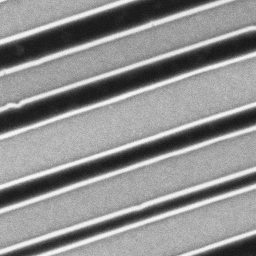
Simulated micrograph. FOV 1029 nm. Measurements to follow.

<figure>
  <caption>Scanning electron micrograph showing one or a few lines or trenches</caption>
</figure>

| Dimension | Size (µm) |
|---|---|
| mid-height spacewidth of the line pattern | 0.155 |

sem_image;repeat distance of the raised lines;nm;263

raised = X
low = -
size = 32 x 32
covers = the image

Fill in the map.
--------------XXXXXXXXXXXXX-----
-----------XXXXXXXXXXXXX--------
--------XXXXXXXXXXXXX-----------
-----XXXXXXXXXXXXX-------------X
--XXXXXXXXXXXXX-------------XXXX
XXXXXXXXXXXX-------------XXXXXXX
XXXXXXXXX-------------XXXXXXXXXX
XXXXXX-------------XXXXXXXXXXX--
XXX-------------XXXXXXXXXX------
-------------XXXXXXXXXX---------
---------XXXXXXXXXXXX-----------
------XXXXXXXXXXXX--------------
---XXXXXXXXXXX------------------
XXXXXXXXXXX-------------------XX
XXXXXXXX-------------------XXXXX
XXXXX-------------------XXXXXXXX
XXX------------------XXXXXXXXXX-
------------------XXXXXXXXX-----
---------------XXXXXXXXX--------
------------XXXXXXXXX-----------
---------XXXXXXXXX--------------
------XXXXXXXXX---------------XX
--XXXXXXXXXX---------------XXXXX
XXXXXXXXX---------------XXXXXXX-
XXXXXX---------------XXXXXXX----
XXX---------------XXXXXXX-------
---------------XXXXXXX----------
------------XXXXXXX-------------
---------XXXXXXX----------------
------XXXXXXX-----------------XX
---XXXXXXX-----------------XXXXX
XXXXXXX-----------------XXXXXXXX